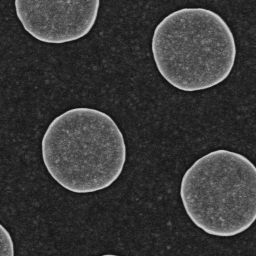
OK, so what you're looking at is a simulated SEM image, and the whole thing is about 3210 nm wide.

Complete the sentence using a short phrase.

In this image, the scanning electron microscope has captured raised bodies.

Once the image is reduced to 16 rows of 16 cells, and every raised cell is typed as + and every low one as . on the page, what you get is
.+++++..........
.+++++....++++..
...+......+++++.
..........+++++.
..........++++..
...........++...
................
....+++.........
...+++++........
...+++++........
...+++++....++++
....+++....+++++
...........+++++
............++++
.............++.
+...............